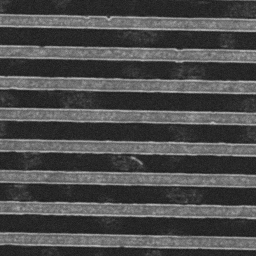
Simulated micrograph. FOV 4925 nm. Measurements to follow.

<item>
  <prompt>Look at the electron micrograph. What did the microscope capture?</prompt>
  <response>parallel lines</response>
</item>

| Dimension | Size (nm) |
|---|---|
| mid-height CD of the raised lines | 226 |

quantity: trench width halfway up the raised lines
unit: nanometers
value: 382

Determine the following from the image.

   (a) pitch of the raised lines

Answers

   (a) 31.2 px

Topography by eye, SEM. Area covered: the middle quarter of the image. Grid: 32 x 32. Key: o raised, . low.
................................
................................
................................
................................
oooooooooooooooooooooooooooooooo
oooooooooooooooooooooooooooooooo
.........ooooooooooooooooooooooo
................................
................................
................................
................................
................................
oooooooooooooooooooooooooooooooo
oooooooooooooooooooooooooooooooo
.............ooo.........ooooooo
................................
................................
................................
................................
ooooooooooooo...................
oooooooooooooooooooooooooooooooo
oooooooooooooooooooooooooooooooo
.............................ooo
................................
................................
................................
................................
ooooooooooooooooooo......o..oo..
oooooooooooooooooooooooooooooooo
oooooooooooooooooooooooooooooooo
................................
................................